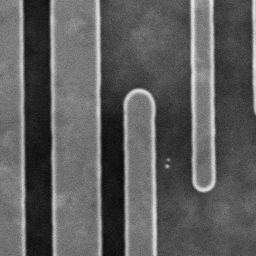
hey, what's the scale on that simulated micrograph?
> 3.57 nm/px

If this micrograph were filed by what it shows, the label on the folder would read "groups of lines, slits or small figures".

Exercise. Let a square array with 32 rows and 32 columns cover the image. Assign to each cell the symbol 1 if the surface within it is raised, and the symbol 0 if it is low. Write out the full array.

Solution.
11100011111100000000000011100000
11100011111100000000000011000000
11100011111100000000000011100000
11100011111100000000000011100000
11100011111100000000000011100000
11100011111100000000000011100000
11100011111100000000000011100000
11100011111100000000000011100000
11100011111100000000000011100000
11100011111100000000000011100000
11100011111100000000000011100000
11100011111100001100000011100000
11100001111100001110000011100000
11100001111100001110000011100000
11100001111100001110000011100000
11100001111110001110000011100000
11100001111110001110000011100000
11100001111110001110000011100000
11100001111110001110000011100000
11100001111110001110000011100000
11100001111110001110000011100000
11100001111110001110000011100000
11100001111110001110000011100000
11100001111110001110000001000000
11100001111110001110000000000000
11100001111110001110000000000000
11100001111110001110000000000000
11100001111110001110000000000000
11100001111110001110000000000000
11100001111110001110000000000000
11100001111110001110000000000000
11100001111110001110000000000000